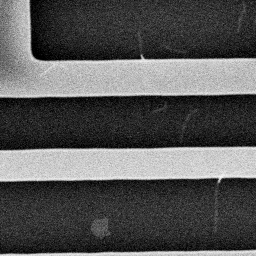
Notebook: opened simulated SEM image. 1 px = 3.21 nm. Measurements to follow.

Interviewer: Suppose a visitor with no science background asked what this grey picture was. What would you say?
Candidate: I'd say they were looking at groups of lines, slits or small figures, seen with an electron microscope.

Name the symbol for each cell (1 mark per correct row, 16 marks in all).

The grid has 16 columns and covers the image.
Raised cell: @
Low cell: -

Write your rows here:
@@--------------
@@--------------
@@--------------
@@--------------
@@@@@@@@@@@@@@@@
@@@@@@@@@@@@@@@@
----------------
----------------
----------------
@@@@@@@@@@@@@@@@
@@@@@@@@@@@@@@@@
----------------
----------------
----------------
----------------
----------------